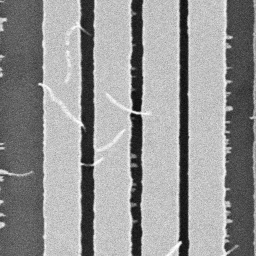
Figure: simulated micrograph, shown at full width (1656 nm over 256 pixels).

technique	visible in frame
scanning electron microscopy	lines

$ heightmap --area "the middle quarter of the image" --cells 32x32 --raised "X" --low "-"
XXXX----XXXXXXXXX---XXXXXXXXX--X
XXXX----XXXXXXXXX---XXXXXXXXX--X
XXXX----XXXXXXXXX---XXXXXXXXX--X
XXXX----XXXXXXXXX---XXXXXXXXX--X
XXXX----XXXXXXXXX---XXXXXXXXX--X
XXXX----XXXXXXXXX---XXXXXXXXX--X
XXXX----XXXXXXXXX---XXXXXXXXX--X
XXXX----XXXXXXXXX---XXXXXXXXX--X
XXXX----XXXXXXXXX---XXXXXXXXX--X
XXXX----XXXXXXXXX---XXXXXXXXX--X
XXXX----XXXXXXXXX---XXXXXXXXX--X
XXXX----XXXXXXXXX--XXXXXXXXXX--X
XXXX----XXXXXXXXX--XXXXXXXXXX--X
XXXX----XXXXXXXXX---XXXXXXXXX--X
XXXXX---XXXXXXXXX---XXXXXXXXX--X
XXXXX---XXXXXXXXX---XXXXXXXXX--X
XXXX----XXXXXXXXX---XXXXXXXXX--X
XXXX----XXXXXXXXX---XXXXXXXXX--X
XXXX----XXXXXXXXX---XXXXXXXXX--X
XXXX----XXXXXXXXX---XXXXXXXXX--X
XXXX----XXXXXXXXX---XXXXXXXXX--X
XXXX----XXXXXXXXX---XXXXXXXXX--X
XXXX----XXXXXXXXX---XXXXXXXXX--X
XXXX----XXXXXXXXX---XXXXXXXXX--X
XXXX----XXXXXXXXX---XXXXXXXXX--X
XXXX---XXXXXXXXXX---XXXXXXXXX--X
XXXX----XXXXXXXXX---XXXXXXXXX--X
XXXX----XXXXXXXXX---XXXXXXXXX--X
XXXX----XXXXXXXXX---XXXXXXXXX--X
XXXX----XXXXXXXXX---XXXXXXXXX--X
XXXX----XXXXXXXXX---XXXXXXXXX--X
XXXX----XXXXXXXXX---XXXXXXXXX--X